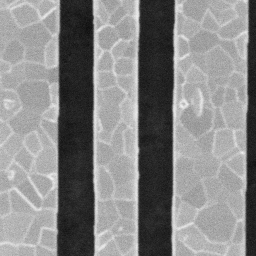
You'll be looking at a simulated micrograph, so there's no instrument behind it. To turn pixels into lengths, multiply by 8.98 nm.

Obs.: lines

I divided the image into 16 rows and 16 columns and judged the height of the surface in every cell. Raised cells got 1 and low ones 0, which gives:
1111001110011110
1111001110011110
1111001110011110
1111001110011110
1111001110011110
1111001110011110
1111001110011110
1111001110011110
1111001110011110
1111001110011110
1111001110011110
1111001110011110
1111001110011110
1111001110011110
1111001110011110
1111001110011110